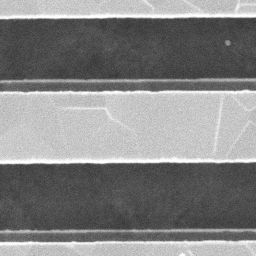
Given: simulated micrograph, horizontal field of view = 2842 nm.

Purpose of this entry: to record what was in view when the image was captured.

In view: lines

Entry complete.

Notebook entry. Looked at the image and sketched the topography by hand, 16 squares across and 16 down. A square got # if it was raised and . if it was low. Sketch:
################
................
................
................
................
################
################
################
################
################
................
................
................
................
################
################